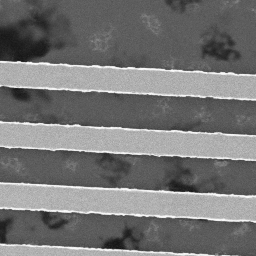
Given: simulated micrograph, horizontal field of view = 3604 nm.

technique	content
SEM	parallel lines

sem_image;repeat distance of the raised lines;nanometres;855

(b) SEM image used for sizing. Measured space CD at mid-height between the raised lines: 512 nm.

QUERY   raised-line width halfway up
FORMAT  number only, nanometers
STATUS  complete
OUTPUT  353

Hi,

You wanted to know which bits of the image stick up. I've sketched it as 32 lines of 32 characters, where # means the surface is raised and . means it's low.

................................
................................
................................
................................
................................
................................
................................
................................
###############.................
################################
################################
..............##################
................................
................................
................................
####............................
#######################.........
################################
....############################
.......................#########
................................
................................
................................
###########.....................
##############################..
################################
..........#.####################
............................####
................................
................................
................................
##################..............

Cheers